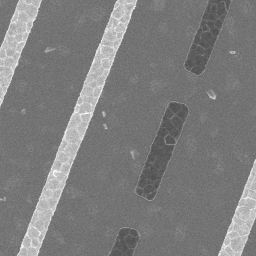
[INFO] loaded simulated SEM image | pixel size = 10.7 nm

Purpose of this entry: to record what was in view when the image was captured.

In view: one or a few lines or trenches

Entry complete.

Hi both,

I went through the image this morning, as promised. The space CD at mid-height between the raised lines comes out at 725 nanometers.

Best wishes